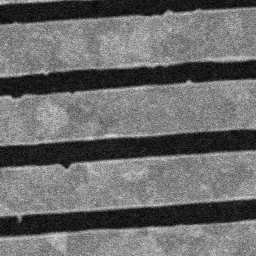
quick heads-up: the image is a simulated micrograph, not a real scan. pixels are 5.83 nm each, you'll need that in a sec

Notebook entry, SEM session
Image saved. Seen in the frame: one or a few lines or trenches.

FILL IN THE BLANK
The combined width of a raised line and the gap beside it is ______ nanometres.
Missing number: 413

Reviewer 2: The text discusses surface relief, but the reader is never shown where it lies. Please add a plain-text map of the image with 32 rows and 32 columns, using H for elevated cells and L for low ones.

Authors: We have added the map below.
LLLLLLLLLLLLLLLLLLLLLLLLLLLLLLLL
LLLLLLLLLLLLLLLLLLLLLHLLHHHHHHHH
LLLLLLLLLLHHHHHHHHHHHHHHHHHHHHHH
HHHHHHHHHHHHHHHHHHHHHHHHHHHHHHHH
HHHHHHHHHHHHHHHHHHHHHHHHHHHHHHHH
HHHHHHHHHHHHHHHHHHHHHHHHHHHHHHHH
HHHHHHHHHHHHHHHHHHHHHHHHHHHHHHHH
HHHHHHHHHHHHHHHHHHHHHHHHHHHHHHHL
HHHHHHHHHHHHLLLLLLLLLLLLLLLLLLLL
HHLLLLLLLLLLLLLLLLLLLLLLLLLLLLLL
LLLLLLLLLLLLLLLLLLLLLLLHHHHHHHHH
LLLLLLLLLLLHHHHHHHHHHHHHHHHHHHHH
HHHHHHHHHHHHHHHHHHHHHHHHHHHHHHHH
HHHHHHHHHHHHHHHHHHHHHHHHHHHHHHHH
HHHHHHHHHHHHHHHHHHHHHHHHHHHHHHHH
HHHHHHHHHHHHHHHHHHHHHHHHHHHHHHHH
HHHHHHHHHHHHHHHHHHHHHHHLLLLLLLLL
HHHHHHHHLHLLLLLLLLLLLLLLLLLLLLLL
LLLLLLLLLLLLLLLLLLLLLLLLLLLLLLLL
LLLLLLLLLLLLLLLLLLLLLLLHHHHHHHHH
LLLLLLLLLHHHHHHHHHHHHHHHHHHHHHHH
HHHHHHHHHHHHHHHHHHHHHHHHHHHHHHHH
HHHHHHHHHHHHHHHHHHHHHHHHHHHHHHHH
HHHHHHHHHHHHHHHHHHHHHHHHHHHHHHHH
HHHHHHHHHHHHHHHHHHHHHHHHHHHHHHHH
HHHHHHHHHHHHHHHHHHHHHHLLLLLLLLLL
HHHHHHHLLLLLLLLLLLLLLLLLLLLLLLLL
LLLLLLLLLLLLLLLLLLLLLLLLLLLLLLLL
LLLLLLLLLLLLLLLLLLLLHHHHHHHHHHHH
LLLLLLHHHHHHHHHHHHHHHHHHHHHHHHHH
HHHHHHHHHHHHHHHHHHHHHHHHHHHHHHHH
HHHHHHHHHHHHHHHHHHHHHHHHHHHHHHHH